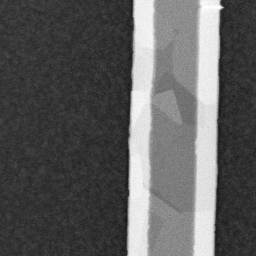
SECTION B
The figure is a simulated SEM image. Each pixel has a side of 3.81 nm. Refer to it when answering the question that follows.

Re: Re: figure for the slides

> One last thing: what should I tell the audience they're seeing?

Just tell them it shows one or a few lines or trenches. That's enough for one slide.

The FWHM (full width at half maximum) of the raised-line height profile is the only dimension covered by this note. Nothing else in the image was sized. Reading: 245 nm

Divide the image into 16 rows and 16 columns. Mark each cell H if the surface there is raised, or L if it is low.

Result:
LLLLLLLLLHHHHLLL
LLLLLLLLLHHHHLLL
LLLLLLLLLHHHHLLL
LLLLLLLLLHHHHLLL
LLLLLLLLLHHHHLLL
LLLLLLLLLHHHHLLL
LLLLLLLLLHHHHLLL
LLLLLLLLLHHHHLLL
LLLLLLLLLHHHHLLL
LLLLLLLLLHHHHLLL
LLLLLLLLLHHHHLLL
LLLLLLLLLHHHHLLL
LLLLLLLLLHHHHLLL
LLLLLLLLLHHHHLLL
LLLLLLLLLHHHHLLL
LLLLLLLLLHHHHLLL